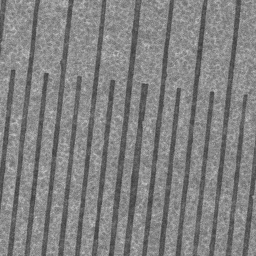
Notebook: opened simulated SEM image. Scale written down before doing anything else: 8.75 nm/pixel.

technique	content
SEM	parallel lines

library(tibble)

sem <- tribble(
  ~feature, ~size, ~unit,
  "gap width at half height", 47.8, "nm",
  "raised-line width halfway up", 0.0956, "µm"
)